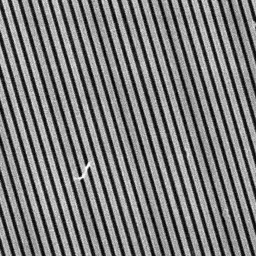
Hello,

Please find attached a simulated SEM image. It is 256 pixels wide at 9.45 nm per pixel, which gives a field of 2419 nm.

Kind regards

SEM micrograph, parallel lines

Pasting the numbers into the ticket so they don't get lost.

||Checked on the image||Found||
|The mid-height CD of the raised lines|46.4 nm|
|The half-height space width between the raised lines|4.79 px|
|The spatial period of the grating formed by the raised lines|0.0906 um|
